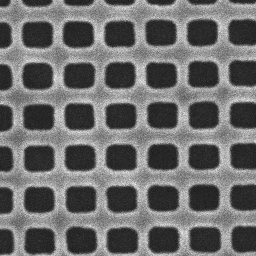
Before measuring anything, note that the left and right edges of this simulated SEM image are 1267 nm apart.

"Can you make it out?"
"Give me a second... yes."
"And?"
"a regular array of holes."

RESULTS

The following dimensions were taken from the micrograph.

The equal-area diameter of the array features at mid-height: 154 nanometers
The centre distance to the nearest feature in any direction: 203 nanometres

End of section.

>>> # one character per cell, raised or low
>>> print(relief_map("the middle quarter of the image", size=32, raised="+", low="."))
.......++++.......+++.......+++.
........++........++........+++.
........++........+++.......+++.
........++........+++.......+++.
........++........+++.......+++.
.......++++.......+++.......++++
++++++++++++++++++++++++++++++++
++++++++++++++++++++++++++++++++
++++++++++++++++++++++++++++++++
++++++++++++++++++++++++.+++++++
.......++++.......+++.......+++.
.......+++........+++.......+++.
........++........+++.......+++.
........++........+++.......+++.
........++........+++.......+++.
........+++.......+++.......+++.
++.+..++++++++++++++++++++++++++
++++++++++++++++++++++++++++++++
++++++++++++++++++++++++++++++++
++++++++++++++++++++++++++++++++
+......++++......++++.......++++
........+++.......+++........++.
........++........+++........++.
........++........+++........++.
........++........+++........++.
........+++.......+++.......+++.
+......+++++.....+++++++...+++++
++++++++++++++++++++++++++++++++
++++++++++++++++++++++++++++++++
++++++++++++++++++++++++++++++++
++....++++++..+..+++++.....+++++
+.......+++.......+++.......+++.